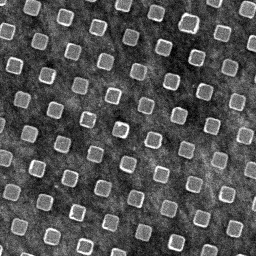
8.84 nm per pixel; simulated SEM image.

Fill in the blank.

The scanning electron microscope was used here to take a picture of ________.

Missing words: a regular array of raised bodies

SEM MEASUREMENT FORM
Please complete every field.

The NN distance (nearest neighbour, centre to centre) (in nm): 303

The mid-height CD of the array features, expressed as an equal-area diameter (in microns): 0.145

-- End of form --